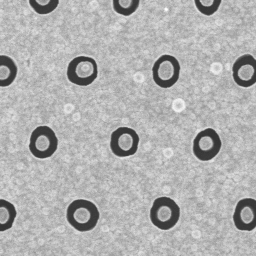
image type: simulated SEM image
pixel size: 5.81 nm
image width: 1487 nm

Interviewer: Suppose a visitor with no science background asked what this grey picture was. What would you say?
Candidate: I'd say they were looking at ring-shaped grooves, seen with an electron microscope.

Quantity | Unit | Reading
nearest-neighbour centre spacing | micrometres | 0.464